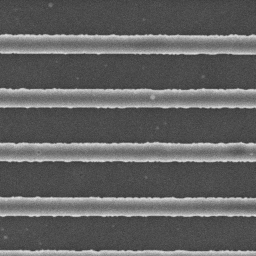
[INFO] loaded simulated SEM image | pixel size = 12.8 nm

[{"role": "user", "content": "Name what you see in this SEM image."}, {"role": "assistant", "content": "lines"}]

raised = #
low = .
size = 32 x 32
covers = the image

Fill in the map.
................................
................................
................................
................................
################################
################################
################################
................................
................................
................................
................................
################################
################################
................................
................................
................................
................................
................................
################################
################################
................................
................................
................................
................................
................................
################################
################################
................................
................................
................................
................................
################################